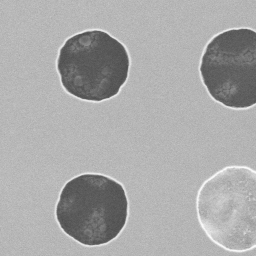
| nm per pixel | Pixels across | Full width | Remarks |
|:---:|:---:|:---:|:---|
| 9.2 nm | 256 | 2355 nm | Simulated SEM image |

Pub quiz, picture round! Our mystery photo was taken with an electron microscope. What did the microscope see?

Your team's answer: holes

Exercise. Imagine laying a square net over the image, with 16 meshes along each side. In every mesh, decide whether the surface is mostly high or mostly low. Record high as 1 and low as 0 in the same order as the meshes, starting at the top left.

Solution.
1111111111111111
1111111111111111
1111000111111000
1111000011111000
1111000011111000
1111000111111000
1111111111111100
1111111111111111
1111111111111111
1111111111111111
1111111111111111
1111000111111111
1111000011111111
1111000011111111
1111000111111111
1111111111111111